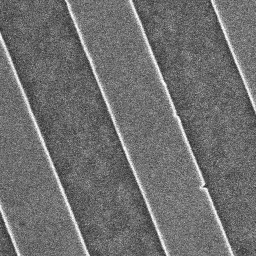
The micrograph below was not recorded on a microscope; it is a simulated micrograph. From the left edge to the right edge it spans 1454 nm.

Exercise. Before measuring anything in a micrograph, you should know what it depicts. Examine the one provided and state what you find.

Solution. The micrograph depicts one or a few lines or trenches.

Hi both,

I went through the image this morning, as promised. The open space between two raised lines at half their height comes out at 73.5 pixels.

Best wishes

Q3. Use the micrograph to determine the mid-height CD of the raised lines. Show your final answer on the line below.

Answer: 0.345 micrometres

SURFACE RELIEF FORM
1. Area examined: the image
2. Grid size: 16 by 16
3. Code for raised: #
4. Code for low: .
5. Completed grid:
....####.....###
.....####.....##
.....####.....##
#....#####.....#
#.....####.....#
#.....####.....#
##.....####.....
##.....####.....
###....#####....
###.....####....
###.....####....
####.....####...
####.....####...
#####....#####..
.####.....####..
.####.....####..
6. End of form